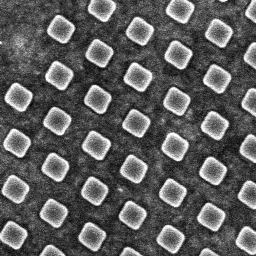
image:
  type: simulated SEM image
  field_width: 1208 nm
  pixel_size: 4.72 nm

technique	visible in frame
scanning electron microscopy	a regular array of raised bodies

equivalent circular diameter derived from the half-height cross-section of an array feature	116	nanometers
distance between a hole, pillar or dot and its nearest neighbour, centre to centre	0.213	µm